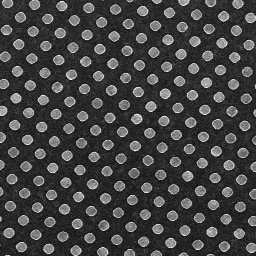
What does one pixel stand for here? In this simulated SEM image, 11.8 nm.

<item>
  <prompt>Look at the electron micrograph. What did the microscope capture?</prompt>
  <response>a regular array of raised bodies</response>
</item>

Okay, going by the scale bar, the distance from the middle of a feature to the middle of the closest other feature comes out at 221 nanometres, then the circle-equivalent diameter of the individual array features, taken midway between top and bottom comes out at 0.117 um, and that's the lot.